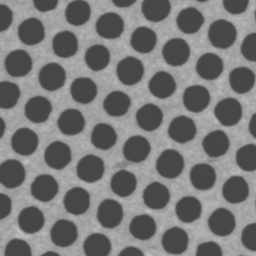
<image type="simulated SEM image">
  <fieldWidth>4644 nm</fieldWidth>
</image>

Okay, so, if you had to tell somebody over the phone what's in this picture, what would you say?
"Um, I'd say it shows a regular array of holes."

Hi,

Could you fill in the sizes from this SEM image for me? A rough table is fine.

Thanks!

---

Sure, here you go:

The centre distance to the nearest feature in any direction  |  0.624 microns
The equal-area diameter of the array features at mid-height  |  501 nanometers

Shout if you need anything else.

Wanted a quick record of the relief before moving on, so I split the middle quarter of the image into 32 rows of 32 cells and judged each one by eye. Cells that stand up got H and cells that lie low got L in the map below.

HHHHHHLLLLLHHLLLLLLLHHHHHHHLLHHH
HHHHHHHLLHHHHLLLLLLLHHHHHHHHHHHH
HHHHHHHHHHHHHLLLLLLLHHHLLLLHHHHH
HHHLLLHHHHHHHLLLLLLHHHLLLLLHHHHH
HHLLLLLLHHHHHHLLLLLHHLLLLLLLHHHH
HHLLLLLLHHHHHHHHHHHHHLLLLLLLHHHL
HLLLLLLLHHHHHHHHHHHHHLLLLLLLHHLL
HHLLLLLLHHHLLLLLHHHHHHLLLLLHHHLL
HHLLLLLLHHLLLLLLHHHHHHHHLLHHHHLL
HHHLLLLHHHLLLLLLLHHHHHHHHHHHHHLL
HHHHHHHHHHLLLLLLHHHHLLLHHHHHHHLL
LLLLHHHHHHLLLLLLHHHLLLLLHHHHHHHL
LLLLLHHHHHHLLLLHHHLLLLLLLHHHHHHH
LLLLLHHHHHHHHHHHHHLLLLLLLHHHLLLH
LLLLLHHHHHHHHHHHHHLLLLLLHHHLLLLL
LLLLLHHHLLLLHHHHHHHLLLLLHHLLLLLL
LLLLLHHLLLLLLHHHHHHHLLLHHHLLLLLL
LLLHHHHLLLLLLHHHHHHHHHHHHHLLLLLL
HHHHHHHLLLLLLHHHLLLLHHHHHHHLLLLL
HHHHHHHLLLLLLHHLLLLLLHHHHHHHLLLH
LHHHHHHHLLLLHHHLLLLLLLHHHHHHHHHH
LLHHHHHHHLLHHHHLLLLLLLHHHLLLHHHH
LLHHHHLHHHHHHHHLLLLLLHHHLLLLLHHH
LLHHLLLLLHHHHHHLLLLLLHHLLLLLLLHH
LHHHLLLLLLHHHHHHHLLHHHHLLLLLLLHH
LHHLLLLLLLHHHHHHHHHHHHHLLLLLLLHH
HHHLLLLLLLHHHHLHHHHHHHHLLLLLLLHH
HHHLLLLLLLHHLLLLLHHHHHHHLLLLLHHL
HHHHLLLLLHHHLLLLLLHHHHHHHLLLHHHL
HHHHHHLLHHHHLLLLLLHHHHLHHHHHHHHH
HHHHHHHHHHHLLLLLLLHHHLLLLHHHHHHH
HLLLLHHHHHHHLLLLLLHHLLLLLLHHHHHH